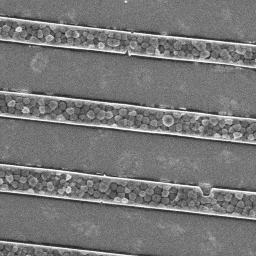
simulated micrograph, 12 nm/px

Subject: one or a few lines or trenches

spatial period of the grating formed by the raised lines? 890 nm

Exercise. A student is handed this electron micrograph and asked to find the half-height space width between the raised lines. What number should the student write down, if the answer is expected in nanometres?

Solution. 598